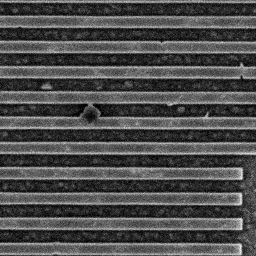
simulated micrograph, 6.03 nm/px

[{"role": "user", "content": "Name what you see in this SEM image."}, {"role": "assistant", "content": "parallel lines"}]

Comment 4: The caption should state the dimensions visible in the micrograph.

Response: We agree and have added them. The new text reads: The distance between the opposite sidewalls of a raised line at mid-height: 68.6 nm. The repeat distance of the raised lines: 0.152 µm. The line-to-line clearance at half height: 85.2 nanometres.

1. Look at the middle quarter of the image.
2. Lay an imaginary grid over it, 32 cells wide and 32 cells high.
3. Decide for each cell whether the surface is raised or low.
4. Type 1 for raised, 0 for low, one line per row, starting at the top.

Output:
00000000000000000000000000000000
11111111111111111111111111111111
11111111111111111111111111111111
00000000000000000000000000000000
00000000000000000000000000000000
00000000000000000000000000000000
00000000000000000000000000000000
11111111111111111111111111111111
11111111111111111111111111111111
11111111111111111111111111111111
00000010000000000000000000000000
00000111100000000000000000000000
00001111100000000000000000000000
11111111111111111110000000000001
11111111111111111111111111111111
11111111111111111111111111111111
00000000000000000000000000000000
00000000000000000000000000000000
00000000000000000000000000000000
00000000000000000000000000000000
11111111111111111111111111111111
11111111111111111111111111111111
00000000000000000000000000000000
00000000000000000000000000000000
00000000000000000000000000000000
00000000000000000000000000000000
11111111111111111111111111111111
11111111111111111111111111111111
11111111111111111111111111111111
00000000000000000000000000000000
00000000000000000000000000000000
00000000000000000000000000000000